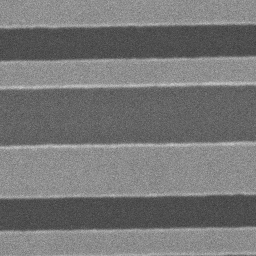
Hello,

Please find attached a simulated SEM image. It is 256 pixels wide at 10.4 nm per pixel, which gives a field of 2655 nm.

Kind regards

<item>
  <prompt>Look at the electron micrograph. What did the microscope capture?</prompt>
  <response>lines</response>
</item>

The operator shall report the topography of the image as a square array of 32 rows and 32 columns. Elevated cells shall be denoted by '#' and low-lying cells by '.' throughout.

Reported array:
################################
################################
################################
................................
................................
................................
................................
............####################
################################
################################
#######################.........
................................
................................
................................
................................
................................
................................
................................
.###############################
################################
################################
################################
################################
################################
#############.#.................
................................
................................
................................
..............................##
################################
################################
################################